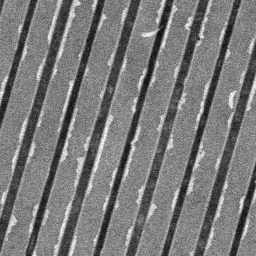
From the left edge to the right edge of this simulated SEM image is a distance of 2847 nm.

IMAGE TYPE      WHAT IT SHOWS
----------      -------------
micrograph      parallel lines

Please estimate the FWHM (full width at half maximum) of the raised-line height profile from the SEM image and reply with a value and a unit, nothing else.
267 nanometers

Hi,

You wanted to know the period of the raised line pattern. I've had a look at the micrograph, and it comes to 363 nm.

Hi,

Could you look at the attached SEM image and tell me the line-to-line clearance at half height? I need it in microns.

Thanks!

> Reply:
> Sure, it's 0.0869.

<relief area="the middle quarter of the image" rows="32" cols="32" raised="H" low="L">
HHHHLLHHHHHHLLLHHHHHHLLHHHHHHLLL
HHHLLHHHHHHHLLHHHHHHHLHHHHHHHLLH
HHHLLHHHHHHLLLHHHHHHLLHHHHHHLLLH
HHHLLHHHHHHLLLHHHHHHLLHHHHHHLLLH
HHLLHHHHHHHLLHHHHHHHLLHHHHHHLLHH
HHLLHHHHHHLLLHHHHHHLLHHHHHHLLLHH
HHLLHHHHHHLLLHHHHHHLLHHHHHHLLLHH
HHLLHHHHHHLLLHHHHHHLLHHHHHHLLLHH
HLLHHHHHHHLLHHHHHHHLHHHHHHHLLHHH
HLLHHHHHHLLLHHHHHHLLHHHHHHLLLHHH
HLLHHHHHHLLLHHHHHHLLHHHHHHLLLHHH
LLHHHHHHHLLHHHHHHHLLHHHHHHLLHHHH
LLHHHHHHLLLHHHHHHLLHHHHHHLLLHHHH
LLHHHHHHLLLHHHHHHLLHHHHHHLLLHHHH
LLHHHHHHLLLHHHHHHLLHHHHHHLLLHHHH
LHHHHHHLLLHHHHHHHLHHHHHHLLLHHHHH
LHHHHHHLLLHHHHHHLLHHHHHHLLLHHHHH
LHHHHHHLLLHHHHHHLLHHHHHHLLLHHHHH
HHHHHHLLLHHHHHHHLLHHHHHHLLHHHHHH
HHHHHHLLLHHHHHHLLHHHHHHLLLHHHHHH
HHHHHHLLLHHHHHHLLHHHHHHLLLHHHHHH
HHHHHHLLLHHHHHHLLHHHHHHLLLHHHHHH
HHHHHHLLHHHHHHHLHHHHHHHLLHHHHHHL
HHHHHLLLHHHHHHLLHHHHHHLLLHHHHHHL
HHHHHLLLHHHHHHLLHHHHHHLLLHHHHHHL
HHHHHLLHHHHHHLLLHHHHHHLLHHHHHHLL
HHHHLLLHHHHHHLLHHHHHHLLLHHHHHHLL
HHHHLLLHHHHHHLLHHHHHHLLLHHHHHHLL
HHHHLLLHHHHHHLLHHHHHHLLLHHHHHHLL
HHHHLLHHHHHHLLHHHHHHHLLHHHHHHLLH
HHHLLLHHHHHHLLHHHHHHLLLHHHHHHLLH
HHHLLLHHHHHHLLHHHHHHLLLHHHHHHLLH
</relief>